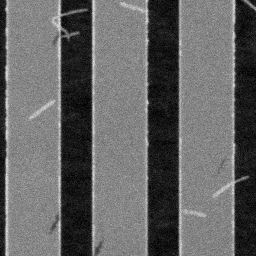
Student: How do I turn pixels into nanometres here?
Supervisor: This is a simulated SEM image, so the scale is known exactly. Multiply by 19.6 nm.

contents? lines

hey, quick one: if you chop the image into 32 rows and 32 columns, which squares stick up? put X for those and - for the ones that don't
-XXXXXX-----XXXXXX----XXXXXXX---
-XXXXXXX----XXXXXX----XXXXXXX---
-XXXXXX-----XXXXXX----XXXXXXX---
-XXXXXXX----XXXXXX----XXXXXXX---
-XXXXXX-----XXXXXX----XXXXXXX---
-XXXXXX-----XXXXXX----XXXXXXX---
-XXXXXX-----XXXXXX----XXXXXXX---
-XXXXXX-----XXXXXX----XXXXXXX---
-XXXXXX-----XXXXXX----XXXXXXX---
-XXXXXX-----XXXXXX----XXXXXXX---
-XXXXXX-----XXXXXX----XXXXXXX---
-XXXXXX-----XXXXXX----XXXXXXX---
-XXXXXX-----XXXXXX----XXXXXXX---
-XXXXXX-----XXXXXX----XXXXXXX---
-XXXXXX-----XXXXXX----XXXXXXX---
-XXXXXX-----XXXXXX----XXXXXXX---
-XXXXXX-----XXXXXX----XXXXXXX---
-XXXXXX-----XXXXXX----XXXXXXX---
-XXXXXX-----XXXXXX----XXXXXXX---
-XXXXXX-----XXXXXX----XXXXXXX---
-XXXXXX-----XXXXXX----XXXXXXX---
-XXXXXX-----XXXXXX----XXXXXXX---
-XXXXXX-----XXXXXX----XXXXXXX---
-XXXXXX-----XXXXXX----XXXXXXX---
-XXXXXX-----XXXXXX----XXXXXXX---
-XXXXXX-----XXXXXX----XXXXXXX---
-XXXXXX-----XXXXXX----XXXXXXX---
-XXXXXX-----XXXXXX----XXXXXXX---
-XXXXXX-----XXXXXX----XXXXXXX---
-XXXXXX-----XXXXXX----XXXXXXX---
-XXXXXX-----XXXXXX----XXXXXXX---
-XXXXXX-----XXXXXX----XXXXXXX---